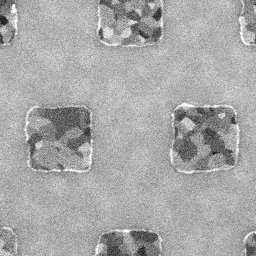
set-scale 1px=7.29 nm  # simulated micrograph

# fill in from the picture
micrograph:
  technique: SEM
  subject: raised bodies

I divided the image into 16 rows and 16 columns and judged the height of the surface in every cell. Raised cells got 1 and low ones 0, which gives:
1000001111000001
1000001111000001
1000001111000001
0000000000000000
0000000000000000
0000000000000000
0000000000000000
0011110000011110
0011110000011110
0011110000011110
0011100000011100
0000000000000000
0000000000000000
0000000000000000
1000000110000000
1000001111000001